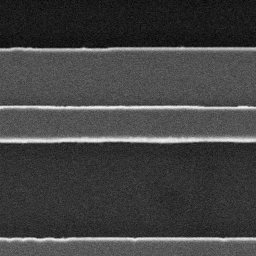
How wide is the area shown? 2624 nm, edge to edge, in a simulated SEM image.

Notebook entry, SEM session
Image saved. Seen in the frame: lines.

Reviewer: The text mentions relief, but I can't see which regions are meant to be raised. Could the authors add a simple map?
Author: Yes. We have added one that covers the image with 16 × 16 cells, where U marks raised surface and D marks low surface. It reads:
DDDDDDDDDDDDDDDD
DDDDDDDDDDDDDDDD
DDDDDDDDDDDDDDDD
UUUUUUUUUUUUUUUU
UUUUUUUUUUUUUUUU
UUUUUUUUUUUUUUUU
UUUUUUUUUUUUUUUU
UUUUUUUUUUUUUUUU
UUUUUUUUUUUUUUUU
DDDDDDDDDDDDDDDD
DDDDDDDDDDDDDDDD
DDDDDDDDDDDDDDDD
DDDDDDDDDDDDDDDD
DDDDDDDDDDDDDDDD
DDDDDDDDDDDDDDDD
UUUUUUUUUUUUUUUU